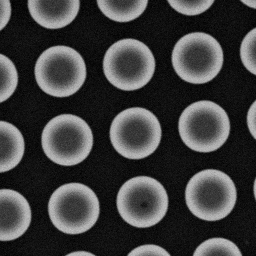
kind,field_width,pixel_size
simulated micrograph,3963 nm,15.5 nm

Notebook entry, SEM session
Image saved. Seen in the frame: an array of small figures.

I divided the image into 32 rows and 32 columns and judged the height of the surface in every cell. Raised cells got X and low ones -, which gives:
X---XXXXXX--XXXXXX---XXXXX-----X
X---XXXXXX---XXXXX----XXX-------
X---XXXXX-----XX----------------
------X-------------------------
-----------------------XXX-----X
--------------XXXX----XXXXX---XX
------XXXX---XXXXXX---XXXXXX--XX
X----XXXXX---XXXXXX---XXXXXX--XX
XX--XXXXXXX--XXXXXX---XXXXXX---X
XX--XXXXXXX--XXXXXX---XXXXX-----
XX---XXXXX----XXXX--------------
XX----XXX-----------------------
X-------------------------------
-----------------------XXXXX---X
-------XX------XXXX----XXXXX---X
X-----XXXXX---XXXXXX--XXXXXXX--X
XX---XXXXXX---XXXXXX--XXXXXXX--X
XXX--XXXXXXX--XXXXXX---XXXXX----
XXX--XXXXXX---XXXXXX----XXX-----
XXX---XXXXX----XXX--------------
XX-----XX-----------------------
-------------------------XXX----
----------------XXX-----XXXXX---
-------XXXX----XXXXX---XXXXXX---
XXX---XXXXXX---XXXXXX--XXXXXXX--
XXX---XXXXXX---XXXXXX--XXXXXX---
XXXX--XXXXXX---XXXXXX---XXXXX---
XXXX--XXXXXX----XXXX------X-----
XXX----XXXX---------------------
XX------------------------------
-------------------------XXXX---
----------X-----XXXXX---XXXXXX--